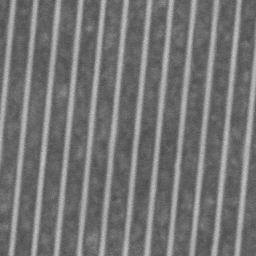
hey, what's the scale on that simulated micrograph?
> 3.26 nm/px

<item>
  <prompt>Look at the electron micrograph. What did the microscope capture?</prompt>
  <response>parallel lines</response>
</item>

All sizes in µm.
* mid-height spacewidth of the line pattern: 0.0593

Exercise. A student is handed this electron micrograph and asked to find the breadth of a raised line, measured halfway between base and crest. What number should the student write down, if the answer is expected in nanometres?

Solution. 14.2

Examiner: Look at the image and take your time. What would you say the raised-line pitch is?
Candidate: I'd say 73.3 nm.